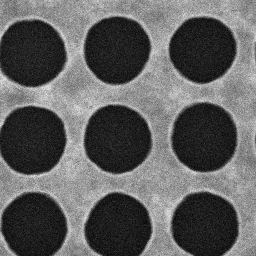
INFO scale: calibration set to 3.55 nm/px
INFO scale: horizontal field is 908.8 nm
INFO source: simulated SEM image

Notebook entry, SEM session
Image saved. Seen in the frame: holes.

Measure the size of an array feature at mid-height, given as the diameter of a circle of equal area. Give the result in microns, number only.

0.241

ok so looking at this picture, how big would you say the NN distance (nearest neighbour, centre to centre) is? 0.307 micrometres